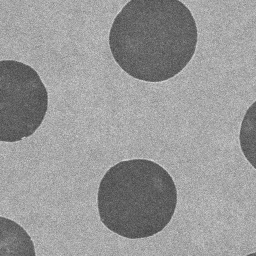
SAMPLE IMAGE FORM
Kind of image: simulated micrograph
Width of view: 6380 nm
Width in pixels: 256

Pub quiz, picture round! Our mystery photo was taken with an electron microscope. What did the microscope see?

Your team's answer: holes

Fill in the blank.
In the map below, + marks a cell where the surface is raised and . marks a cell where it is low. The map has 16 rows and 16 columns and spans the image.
++++++++....++++
+++++++.....++++
+++++++.....++++
+++++++.....++++
..++++++...+++++
...+++++++++++++
...+++++++++++++
...++++++++++++.
..+++++++++++++.
+++++++++++++++.
+++++++...++++++
++++++.....+++++
++++++.....+++++
++++++.....+++++
..+++++...++++++
..++++++++++++++